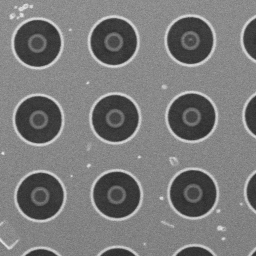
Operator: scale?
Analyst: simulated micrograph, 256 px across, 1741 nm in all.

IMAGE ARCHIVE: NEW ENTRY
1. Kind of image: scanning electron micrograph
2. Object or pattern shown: an array of small figures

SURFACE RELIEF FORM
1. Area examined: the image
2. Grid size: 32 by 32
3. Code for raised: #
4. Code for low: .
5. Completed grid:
################################
################################
####.########...######...######.
##.....#####.....####.....#####.
##..#...###...#..####..##..###..
##..##..###..##..####..##..###..
##......###......####.....#####.
###....#####....######....######
################################
################################
################################
################################
###....#####....######....#####.
##.....#####.....####......####.
##..##..###..##..####..##..###..
##..##..###...#..####..#...####.
##.....#####.....####.....#####.
###....######...#######..#######
################################
################################
################################
#############...#######..#######
###....#####.....#####.....####.
##......####..#...###...#..####.
##..##..####..##..###..##..####.
##......####.....####......####.
###....#####.....#####....######
####..##########################
################################
################################
################################
###....######....#####....######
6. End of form